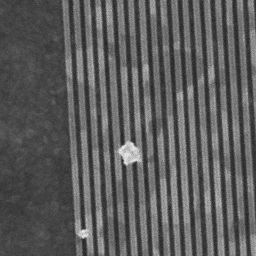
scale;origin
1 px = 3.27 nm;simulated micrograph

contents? parallel lines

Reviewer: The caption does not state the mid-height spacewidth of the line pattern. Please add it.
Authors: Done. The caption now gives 0.0172 microns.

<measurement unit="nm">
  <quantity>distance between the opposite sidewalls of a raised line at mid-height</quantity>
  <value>17.2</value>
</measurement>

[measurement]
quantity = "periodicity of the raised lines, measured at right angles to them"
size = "10.9 px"